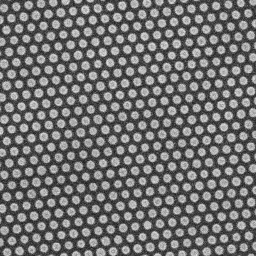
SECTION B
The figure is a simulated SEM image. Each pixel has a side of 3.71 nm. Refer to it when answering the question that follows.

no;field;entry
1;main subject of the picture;a regular array of raised bodies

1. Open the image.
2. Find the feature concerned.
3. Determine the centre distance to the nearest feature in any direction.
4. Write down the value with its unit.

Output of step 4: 0.0456 microns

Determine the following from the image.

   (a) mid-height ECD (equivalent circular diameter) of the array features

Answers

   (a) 28.4 nanometres